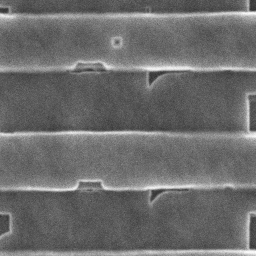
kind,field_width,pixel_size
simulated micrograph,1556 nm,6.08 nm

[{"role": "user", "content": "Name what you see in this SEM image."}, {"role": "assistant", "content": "wiring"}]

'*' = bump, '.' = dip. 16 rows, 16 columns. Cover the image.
................
****************
****************
****************
................
................
................
................
****************
****************
****************
*****.**********
................
................
................
................